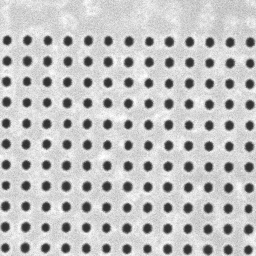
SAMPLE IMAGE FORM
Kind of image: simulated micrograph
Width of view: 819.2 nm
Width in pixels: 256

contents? a regular array of holes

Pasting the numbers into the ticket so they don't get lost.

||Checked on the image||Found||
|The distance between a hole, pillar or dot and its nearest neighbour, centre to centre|0.0643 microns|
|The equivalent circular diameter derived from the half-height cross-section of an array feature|0.0296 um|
